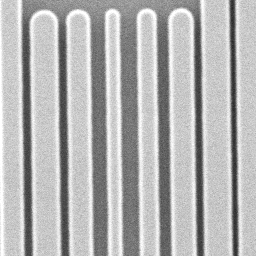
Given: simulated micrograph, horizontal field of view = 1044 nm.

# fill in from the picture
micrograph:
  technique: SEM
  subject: groups of lines, slits or small figures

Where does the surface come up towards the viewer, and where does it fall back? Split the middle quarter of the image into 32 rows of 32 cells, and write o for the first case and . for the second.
.ooooo.....ooo.....oooo....ooooo
.ooooo.....ooo.....oooo....ooooo
.ooooo.....ooo.....oooo....ooooo
.ooooo.....ooo.....oooo....ooooo
.ooooo.....ooo.....oooo....ooooo
.ooooo.....ooo.....oooo....ooooo
.ooooo.....ooo.....oooo....ooooo
.ooooo.....ooo.....oooo....ooooo
.ooooo.....ooo.....oooo....ooooo
.ooooo.....ooo.....oooo....ooooo
.oooooo....ooo.....oooo....ooooo
.oooooo....ooo.....oooo....ooooo
.ooooo.....ooo.....oooo....ooooo
.ooooo.....ooo.....oooo....ooooo
.ooooo.....ooo.....oooo....ooooo
.oooooo....ooo.....oooo....ooooo
.oooooo....ooo.....oooo....ooooo
.oooooo....ooo.....oooo....ooooo
.oooooo....ooo.....oooo....ooooo
.oooooo....ooo.....oooo....ooooo
.oooooo....ooo.....oooo....ooooo
.oooooo....ooo.....oooo....ooooo
.oooooo....ooo.....oooo....ooooo
.oooooo....ooo.....oooo....ooooo
.oooooo....ooo.....oooo....ooooo
.oooooo....ooo.....oooo....ooooo
.oooooo....ooo.....oooo....ooooo
.oooooo....ooo.....oooo....ooooo
.oooooo....ooo.....oooo....ooooo
.oooooo....ooo.....oooo....ooooo
.oooooo....ooo.....oooo....ooooo
.oooooo....ooo.....oooo....ooooo